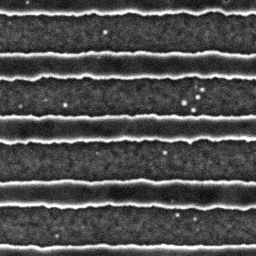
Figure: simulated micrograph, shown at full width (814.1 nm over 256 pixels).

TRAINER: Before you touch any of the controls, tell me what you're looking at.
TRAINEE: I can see lines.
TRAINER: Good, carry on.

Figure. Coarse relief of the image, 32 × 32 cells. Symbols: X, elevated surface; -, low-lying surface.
XXXXXXXXXXXXXXXXXXXXXXXXXXXXXXXX
XXXXXXXXXXXXXXXXXXXXXXXXXX--XXXX
--------------------------------
--------------------------------
--------------------------------
--------------------------------
-----------XXX---X-------XX-----
XXXXXXXXXXXXXXXXXXXXXXXXXXXXXXXX
XXXXXXXXXXXXXXXXXXXXXXXXXXXXXXXX
XXXXXXXXXXXXXXXXXXXXXXXXXXXXXXXX
--------------------------------
--------------------------------
--------------------------------
--------------------------------
-X----X------X-X-XXX-X---X-----X
XXXXXXXXXXXXXXXXXXXXXXXXXXXXXXXX
XXXXXXXXXXXXXXXXXXXXXXXXXXXXXXXX
XXXXXXXXXXXXXXX-XX--XXXX--XX---X
--------------------------------
--------------------------------
--------------------------------
--------------------------------
-----------------X--------------
XXXXXXXXXXXXXXXXXXXXXXXXXXXXXXXX
XXXXXXXXXXXXXXXXXXXXXXXXXXXXXXXX
XXXXXXXXXXXXXXXXXXXXXXXXXXXXXXXX
--------------------------------
--------------------------------
--------------------------------
--------------------------------
--------------------------------
XXXXXXXXXXXXXXXXXXXXXXXXXXXXXXXX